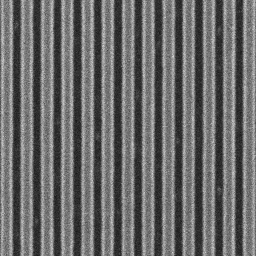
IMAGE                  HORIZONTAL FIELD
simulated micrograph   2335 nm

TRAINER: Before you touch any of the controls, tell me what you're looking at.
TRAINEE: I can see parallel lines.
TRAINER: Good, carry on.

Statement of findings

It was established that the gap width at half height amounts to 99.1 nm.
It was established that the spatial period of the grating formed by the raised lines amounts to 0.184 um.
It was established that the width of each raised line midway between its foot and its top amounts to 90 nanometres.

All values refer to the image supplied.